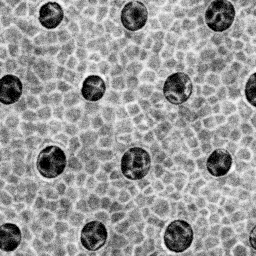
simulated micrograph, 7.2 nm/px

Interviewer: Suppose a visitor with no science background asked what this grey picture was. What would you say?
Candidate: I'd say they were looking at a regular array of holes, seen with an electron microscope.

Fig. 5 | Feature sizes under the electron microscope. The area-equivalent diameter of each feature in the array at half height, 217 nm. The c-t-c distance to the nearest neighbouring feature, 605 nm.